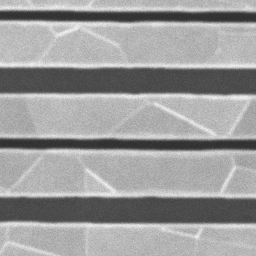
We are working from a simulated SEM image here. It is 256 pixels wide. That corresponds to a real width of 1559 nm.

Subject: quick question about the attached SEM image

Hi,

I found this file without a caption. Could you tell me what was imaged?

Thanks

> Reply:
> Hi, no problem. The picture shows lines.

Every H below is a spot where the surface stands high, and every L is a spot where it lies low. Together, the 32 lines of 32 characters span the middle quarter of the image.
HHHHHHHHHHHHHHHHHHHHHHHHHHHHHHHH
LLLLLLLLLLLLLLLLLLLLLLLLLLLLLLLL
LLLLLLLLLLLLLLLLLLLLLLLLLLLLLLLL
LLLLLLLLLLLLLLLLLLLLLLLLLLLLLLLL
LLLLLLLLLLLLLLLLLLLLLLLLLLLLLLLL
LLLLLLLLLLLLLLLLLLLLLLLLLLLLLLLL
LLLLLLLLLLLLLLLLLLLLLLLLLLLLLLLL
LLLLLLLLLLLLLLLLLLLLLLLLLLLLLLLL
HHHHHHHHHHHHHHHHHHHHHHHHHHHHHHHH
HHHHHHHHHHHHHHHHHHHHHHHHHHHHHHHH
HHHHHHHHHHHHHHHHHHHHHHHHHHHHHHHH
HHHHHHHHHHHHHHHHHHHHHHHHHHHHHHHH
HHHHHHHHHHHHHHHHHHHHHHHHHHHHHHHH
HHHHHHHHHHHHHHHHHHHHHHHHHHHHHHHH
HHHHHHHHHHHHHHHHHHHHHHHHHHHHHHHH
HHHHHHHHHHHHHHHHHHHHHHHHHHHHHHHH
HHHHHHHHHHHHHHHHHHHHHHHHHHHHHHHH
HHHHHHHHHHHHHHHHHHHHHHHHHHHHHHHH
HHHHHHHHHHHHHHHHHHHHHHHHHHHHHHHH
LLLLLLLLLLLLLLLLLLLLLLLLLLLLLLLL
LLLLLLLLLLLLLLLLLLLLLLLLLLLLLLLL
HHHHHHHHHHHHHHHHHHHHLLLLLLLLLLLL
HHHHHHHHHHHHHHHHHHHHHHHHHHHHHHHH
HHHHHHHHHHHHHHHHHHHHHHHHHHHHHHHH
HHHHHHHHHHHHHHHHHHHHHHHHHHHHHHHH
HHHHHHHHHHHHHHHHHHHHHHHHHHHHHHHH
HHHHHHHHHHHHHHHHHHHHHHHHHHHHHHHH
HHHHHHHHHHHHHHHHHHHHHHHHHHHHHHHH
HHHHHHHHHHHHHHHHHHHHHHHHHHHHHHHH
HHHHHHHHHHHHHHHHHHHHHHHHHHHHHHHH
HHHHHHHHHHHHHHHHHHHHHHHHHHHHHHHH
HHHHHHHHHHHHHHHHHHHHHHHHHHHHHHHH